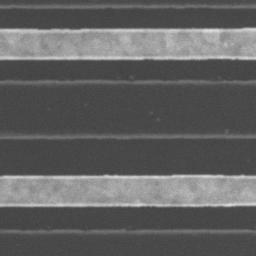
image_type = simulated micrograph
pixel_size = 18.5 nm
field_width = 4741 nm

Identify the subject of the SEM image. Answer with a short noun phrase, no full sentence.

lines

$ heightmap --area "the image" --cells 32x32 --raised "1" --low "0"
11111111111111111111111111111111
00000000000000000000000000000000
00000000000000000000000000000000
00000000000000000000000000000000
11111111111111111111111111111111
11111111111111111111111111111111
11111111111111111111111111111111
00000000000000000000000000000000
00000000000000000000000000000000
00000000000000000000000000000000
11111111111111111111111111111111
11111111111111111111111111111111
11111111111111111111111111111111
11111111111111111111111111111111
11111111111111111111111111111111
11111111111111111111111111111111
11111111111111111111111111111111
00000000000000000000000000000000
00000000000000000000000000000000
00000000000000000000000000000000
00000000000000000000000000000000
00000000000000000000000000000000
11111111111111111111111111111111
11111111111111111111111111111111
11111111111111111111111111111111
11111111111111111111111111111111
00000000000000000000000000000000
00000000000000000000000000000000
00000000000000000000000000000000
11111111111111111111111111111111
11111111111111111111111111111111
11111111111111111111111111111111